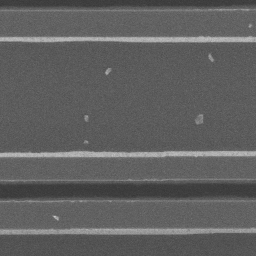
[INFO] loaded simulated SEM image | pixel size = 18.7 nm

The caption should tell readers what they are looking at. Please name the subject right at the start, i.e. lines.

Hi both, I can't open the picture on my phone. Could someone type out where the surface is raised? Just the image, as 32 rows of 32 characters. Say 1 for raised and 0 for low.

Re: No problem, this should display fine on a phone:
00000000000000000000000000000000
11111111111111111111111111111111
11111111111111111111111111111111
11111111111111111111111111111111
11111111111111111111111111111111
00000000000000000000000000000000
00000000000000000000000000000000
00000000000000000000000000000000
00000000000000000000000000000000
00000000000000000000000000000000
00000000000000000000000000000000
00000000000000000000000000000000
00000000000000000000000000000000
00000000000000000000000000000000
00000000000000000000000000000000
00000000000000000000000000000000
00000000000000000000000000000000
00000000000000000000000000000000
00000000000000000000000000000000
00000000111111111111111111111111
11111111111111111111111111111111
11111111111111111111111111111111
11111111111111111111111100000000
00000000000000000000000000000000
00000000000000000000000000000000
11111111111111111111111111111111
11111111111111111111111111111111
11111111111111111111111111111111
11111111111111111111111111111111
00000000000000000000000000000000
00000000000000000000000000000000
00000000000000000000000000000000